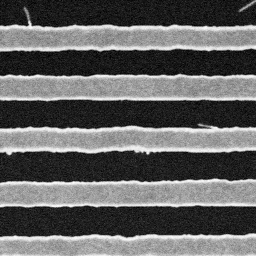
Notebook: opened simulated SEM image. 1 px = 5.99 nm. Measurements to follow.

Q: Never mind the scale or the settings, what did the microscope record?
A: lines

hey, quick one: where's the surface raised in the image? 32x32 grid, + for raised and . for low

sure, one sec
................................
................................
................................
++++++++++++++++++++++++++++++++
++++++++++++++++++++++++++++++++
++++++++++++++++++++++++++++++++
................................
................................
................................
.++.+.......+++++++.+.++.....+++
++++++++++++++++++++++++++++++++
++++++++++++++++++++++++++++++++
.....+..........................
................................
................................
................................
++++++++++++++++++++++++++++++++
++++++++++++++++++++++++++++++++
++++++++++++++++++++++++++++++++
................................
................................
................................
..........................++...+
++++++++++++++++++++++++++++++++
++++++++++++++++++++++++++++++++
++++++++++++++++++++++++++++++++
................................
................................
................................
.+....++..+++++..+++++++++++++++
++++++++++++++++++++++++++++++++
++++++++++++++++++++++++++++++++